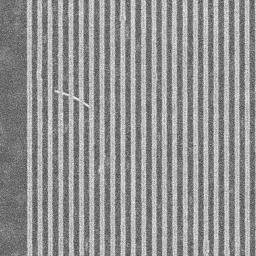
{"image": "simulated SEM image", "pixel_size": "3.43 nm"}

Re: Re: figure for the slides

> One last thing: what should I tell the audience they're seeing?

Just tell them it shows parallel lines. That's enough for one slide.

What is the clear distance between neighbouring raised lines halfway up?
21.4 nm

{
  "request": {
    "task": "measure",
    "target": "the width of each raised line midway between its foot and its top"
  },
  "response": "13.3 nanometres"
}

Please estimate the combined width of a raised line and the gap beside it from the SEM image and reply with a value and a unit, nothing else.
35.5 nm